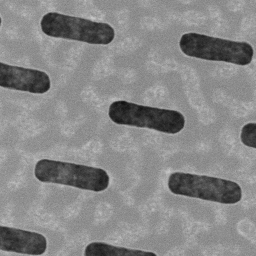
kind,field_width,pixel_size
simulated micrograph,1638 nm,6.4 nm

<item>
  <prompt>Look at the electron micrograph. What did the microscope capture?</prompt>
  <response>holes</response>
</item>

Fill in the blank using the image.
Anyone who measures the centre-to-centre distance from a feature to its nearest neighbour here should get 604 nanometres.